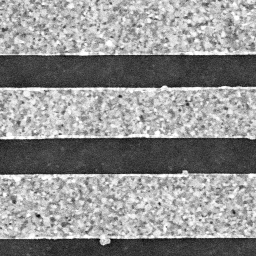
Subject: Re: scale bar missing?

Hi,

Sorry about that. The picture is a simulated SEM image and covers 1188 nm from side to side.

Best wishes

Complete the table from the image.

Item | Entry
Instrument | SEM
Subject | one or a few lines or trenches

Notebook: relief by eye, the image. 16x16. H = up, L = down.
HHHHHHHHHHHHHHHH
HHHHHHHHHHHHHHHH
HHHHHHHHHHHHHHHH
LLLLLLLLLLLLLLLL
LLLLLLLLLLLLLLLL
LLLLLLLLLLHLHHHH
HHHHHHHHHHHHHHHH
HHHHHHHHHHHHHHHH
HHHHHHHHHHHHHHHH
LLLLLLLLLLLLLLLL
LLLLLLLLLLLLLLLL
HHHHHHHHHHHHHHHH
HHHHHHHHHHHHHHHH
HHHHHHHHHHHHHHHH
HHHHHHHHHHHHHHHH
LLLLLLLLLLLLLLLL